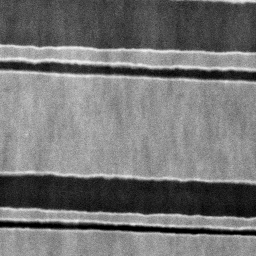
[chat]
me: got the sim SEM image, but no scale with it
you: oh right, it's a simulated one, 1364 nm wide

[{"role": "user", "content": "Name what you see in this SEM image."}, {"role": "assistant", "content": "lines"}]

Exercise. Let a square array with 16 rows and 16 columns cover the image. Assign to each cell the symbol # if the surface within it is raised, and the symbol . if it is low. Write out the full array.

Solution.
................
................
................
################
################
################
################
################
################
################
################
................
................
############....
################
################